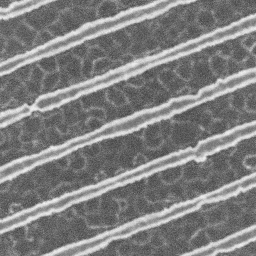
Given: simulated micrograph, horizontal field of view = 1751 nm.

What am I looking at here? parallel lines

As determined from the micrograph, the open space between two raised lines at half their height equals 264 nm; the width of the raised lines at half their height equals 70.8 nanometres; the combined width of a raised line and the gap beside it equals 337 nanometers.